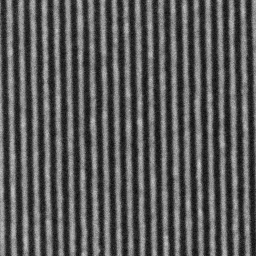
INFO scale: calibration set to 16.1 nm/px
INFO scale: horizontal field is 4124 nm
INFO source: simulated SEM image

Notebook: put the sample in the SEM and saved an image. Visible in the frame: parallel lines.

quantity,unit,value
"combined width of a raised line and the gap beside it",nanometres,188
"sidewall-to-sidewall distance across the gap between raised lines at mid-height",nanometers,125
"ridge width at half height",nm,62.4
